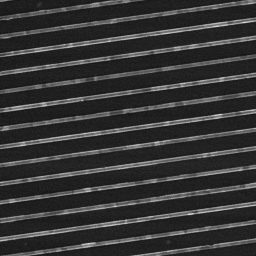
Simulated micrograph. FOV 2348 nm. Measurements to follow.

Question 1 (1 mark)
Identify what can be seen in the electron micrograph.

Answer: parallel lines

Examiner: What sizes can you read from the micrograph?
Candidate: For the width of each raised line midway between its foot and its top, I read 31.8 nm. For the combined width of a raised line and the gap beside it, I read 18.2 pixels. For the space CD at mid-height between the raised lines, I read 0.134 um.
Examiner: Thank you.